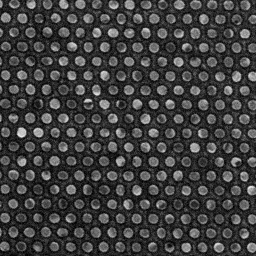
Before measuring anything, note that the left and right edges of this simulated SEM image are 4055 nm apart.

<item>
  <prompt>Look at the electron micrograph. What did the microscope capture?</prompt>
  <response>a regular array of raised bodies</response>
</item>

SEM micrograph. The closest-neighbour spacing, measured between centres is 256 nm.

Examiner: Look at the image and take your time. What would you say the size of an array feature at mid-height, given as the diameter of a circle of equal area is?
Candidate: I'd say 144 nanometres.